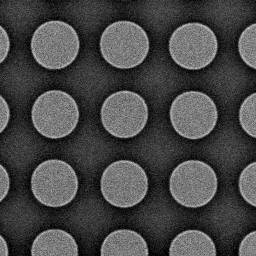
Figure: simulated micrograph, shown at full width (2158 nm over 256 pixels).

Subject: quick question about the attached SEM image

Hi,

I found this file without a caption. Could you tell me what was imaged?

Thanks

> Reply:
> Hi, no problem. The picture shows an array of small figures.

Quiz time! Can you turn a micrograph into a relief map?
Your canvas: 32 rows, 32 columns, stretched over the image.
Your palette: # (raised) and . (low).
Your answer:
................................
................................
................................
.....####....#####....####.....#
#...######...#####....#####...##
#...######...#####...######...##
#...######...#####...######...##
.....####....#####....####.....#
......##...............##.......
................................
................................
......##.......#........#.......
.....####....#####....####.....#
#...######...#####...######...##
#...######...#####...######...##
#...######...#####....#####...##
.....####.....###.....####.....#
................................
................................
................................
.....###......###......###.....#
#...#####....#####....#####...##
#...######...#####...######...##
#...######...#####...######...##
#...#####....#####....#####...##
......##......###......###.....#
................................
................................
................................
.....####.....###.....####.....#
#...#####....#####...######...##
#...######...#####...######...##